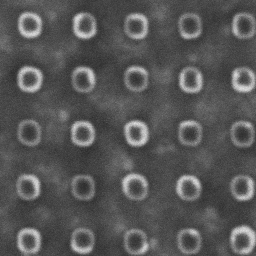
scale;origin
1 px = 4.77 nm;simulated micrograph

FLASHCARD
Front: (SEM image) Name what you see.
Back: a regular array of raised bodies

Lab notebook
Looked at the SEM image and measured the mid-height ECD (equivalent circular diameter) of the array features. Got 115 nm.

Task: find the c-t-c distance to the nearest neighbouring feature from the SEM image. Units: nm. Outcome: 253